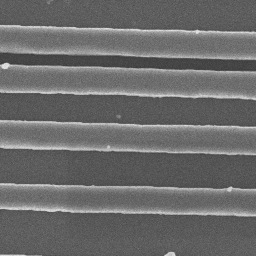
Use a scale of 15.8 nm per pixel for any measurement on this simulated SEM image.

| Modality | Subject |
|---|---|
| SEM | lines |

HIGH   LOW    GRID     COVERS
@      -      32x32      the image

--------------------------------
--------------------------------
--------------------------------
@@@@@@@@@@----------------------
@@@@@@@@@@@@@@@@@@@@@@@@@@@@@@@@
@@@@@@@@@@@@@@@@@@@@@@@@@@@@@@@@
@@@@@@@@@@@@@@@@@@@@@@@@@@@@@@@@
--------------------------------
@@@@@@@@@@@@@@@@----------------
@@@@@@@@@@@@@@@@@@@@@@@@@@@@@@@@
@@@@@@@@@@@@@@@@@@@@@@@@@@@@@@@@
@@@@@@@@@@@@@@@@@@@@@@@@@@@@@@@@
--------------------------------
--------------------------------
--------------------------------
@@@@@@@@@@@@@@@-----------------
@@@@@@@@@@@@@@@@@@@@@@@@@@@@@@@@
@@@@@@@@@@@@@@@@@@@@@@@@@@@@@@@@
--@@@@@@@@@@@@@@@@@@@@@@@@@@@@@@
--------------------------------
--------------------------------
--------------------------------
--------------------------------
@@@@@@@@@@@@@@@@@@@@@@------@---
@@@@@@@@@@@@@@@@@@@@@@@@@@@@@@@@
@@@@@@@@@@@@@@@@@@@@@@@@@@@@@@@@
---------@@@@@@@@@@@@@@@@@@@@@@@
--------------------------------
--------------------------------
--------------------------------
--------------------------------
--------------------------------